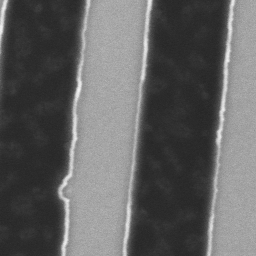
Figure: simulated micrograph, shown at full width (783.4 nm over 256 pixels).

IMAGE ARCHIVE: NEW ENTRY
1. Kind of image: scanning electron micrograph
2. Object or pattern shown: one or a few lines or trenches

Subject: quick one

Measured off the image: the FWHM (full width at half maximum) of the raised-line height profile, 0.263 micrometres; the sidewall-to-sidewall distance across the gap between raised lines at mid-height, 183 nm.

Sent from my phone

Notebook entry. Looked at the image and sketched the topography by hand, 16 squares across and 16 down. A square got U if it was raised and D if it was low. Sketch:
UUUUUUDDDUUUUUUD
UUUUUDDDDUUUUUDD
UUUUUDDDDUUUUUDD
UUUUUDDDDUUUUUDD
UUUUUDDDDUUUUUDD
UUUUUDDDDUUUUUDD
UUUUUDDDDUUUUUDD
UUUUUDDDDUUUUUDD
UUUUUDDDUUUUUUDD
UUUUUDDDUUUUUUDD
UUUUUDDDUUUUUUDD
UUUUDDDDUUUUUUDD
UUUUDDDDUUUUUDDD
UUUUDDDDUUUUUDDD
UUUUDDDDUUUUUDDD
UUUUDDDDUUUUUDDD